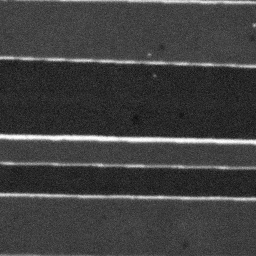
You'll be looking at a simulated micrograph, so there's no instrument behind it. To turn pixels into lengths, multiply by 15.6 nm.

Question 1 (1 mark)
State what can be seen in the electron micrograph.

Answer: lines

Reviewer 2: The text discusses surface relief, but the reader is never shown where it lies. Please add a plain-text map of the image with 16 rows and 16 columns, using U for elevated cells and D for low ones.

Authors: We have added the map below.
UUUUUUUUUUUUUUUU
UUUUUUUUUUUUUUUU
UUUUUUUUUUUUUUUU
UUUUUUUUUUUUUUUU
DDDDDDDDDDDDDDDD
DDDDDDDDDDDDDDDD
DDDDDDDDDDDDDDDD
DDDDDDDDDDDDDDDD
DDDDDDDDDDDDDDDD
UUUUUUUUUUUUUUUU
UUUUUUUUUUUUUUUU
UUUUUUUUUUUUUUUU
UUUUUUUUUUUUUUUU
UUUUUUUUUUUUUUUU
UUUUUUUUUUUUUUUU
UUUUUUUUUUUUUUUU